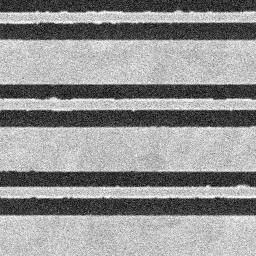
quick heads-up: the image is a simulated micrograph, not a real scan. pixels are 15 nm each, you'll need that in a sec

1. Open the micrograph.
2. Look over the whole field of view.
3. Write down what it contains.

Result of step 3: lines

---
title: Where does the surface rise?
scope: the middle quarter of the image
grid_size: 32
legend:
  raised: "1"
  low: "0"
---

11111111111111111111111111111111
11111111111111111111111111111111
11111111111111111111111111111111
11111111111111111111111111111111
11111111111111111111111111111111
00000000000000000000000000000000
00000000000000000000000000000000
00000000000000000000000000000000
00000000000000000000000000000000
11111111111111111111111111111111
11111111111111111111111111111111
11000000000000000000000000000000
00000000000000000000000000000000
00000000000000000000000000000000
00000000000000000000000000000000
00000000000000000000000000000000
11111111001111111111111111111111
11111111111111111111111111111111
11111111111111111111111111111111
11111111111111111111111111111111
11111111111111111111111111111111
11111111111111111111111111111111
11111111111111111111111111111111
11111111111111111111111111111111
11111111111111111111111111111111
11111111111111111111111111111111
11111111111111111111111111111111
00000000000000000000000000000000
00000000000000000000000000000000
00000000000000000000000000000000
00000000000000000000000000000000
11111111111111111111111111111111